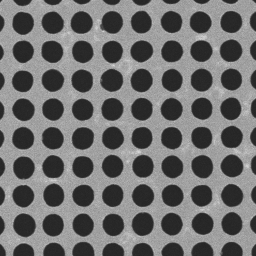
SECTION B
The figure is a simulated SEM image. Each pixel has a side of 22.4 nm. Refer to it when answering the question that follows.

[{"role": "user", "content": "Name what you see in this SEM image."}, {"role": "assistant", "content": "a regular array of holes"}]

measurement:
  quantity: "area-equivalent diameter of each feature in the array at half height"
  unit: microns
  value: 0.495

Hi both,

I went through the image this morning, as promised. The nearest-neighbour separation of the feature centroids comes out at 642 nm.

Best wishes